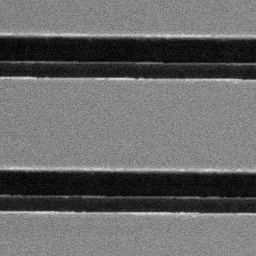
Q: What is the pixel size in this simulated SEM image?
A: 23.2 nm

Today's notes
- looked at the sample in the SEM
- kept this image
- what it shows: lines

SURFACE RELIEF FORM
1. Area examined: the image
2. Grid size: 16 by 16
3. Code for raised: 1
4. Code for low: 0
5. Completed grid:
1111111111111111
1111111111111111
0000000000000000
0000000000000000
0000000000000000
1111111111111111
1111111111111111
1111111111111111
1111111111111111
1111111111111111
1111111111111111
0000000000000000
0000000000000000
1111111111111111
1111111111111111
1111111111111111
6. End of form